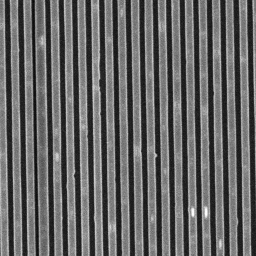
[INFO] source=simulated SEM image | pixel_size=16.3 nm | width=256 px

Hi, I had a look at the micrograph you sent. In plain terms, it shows parallel lines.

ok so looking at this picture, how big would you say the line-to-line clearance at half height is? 0.102 µm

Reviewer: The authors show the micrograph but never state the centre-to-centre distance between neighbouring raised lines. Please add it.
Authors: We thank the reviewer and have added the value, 0.22 µm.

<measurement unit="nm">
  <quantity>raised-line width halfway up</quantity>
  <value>118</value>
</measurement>